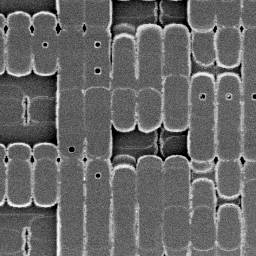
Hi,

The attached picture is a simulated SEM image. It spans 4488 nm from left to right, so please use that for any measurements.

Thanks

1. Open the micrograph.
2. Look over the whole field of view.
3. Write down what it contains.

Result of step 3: wiring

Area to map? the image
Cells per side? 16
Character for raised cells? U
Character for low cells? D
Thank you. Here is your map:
DDDDUUUDDDDDUUUU
UUUUUUUDDDDUUUUU
UUUUUUUUUUUUUUUU
UUUUUUUUUUUUUUUU
UUUUUUUUUUUUDDUU
DDDDUUUUUUUUUUUU
DDDDUUUUUUUUUUUU
DDDDUUUUUUUUUUUU
DDDDUUUDDDDDUUUU
UUUUUUUDDDDDUUUU
UUUUUUUUUUUUUUUU
UUUUUUUUUUUUUUUU
UUUUUUUUUUUUUUUU
DDDDUUUUUUUUUUUU
DDDDUUUUUUUUUUUU
DDDDUUUUUUUUUUUU